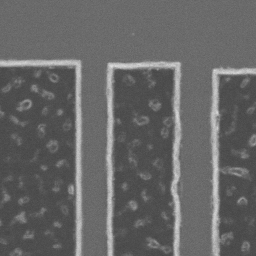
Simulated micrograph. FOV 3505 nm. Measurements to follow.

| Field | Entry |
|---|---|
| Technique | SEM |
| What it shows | one or a few lines or trenches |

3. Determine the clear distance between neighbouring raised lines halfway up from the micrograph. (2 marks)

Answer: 443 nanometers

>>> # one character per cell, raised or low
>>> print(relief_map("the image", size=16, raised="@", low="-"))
----------------
----------------
----------------
----------------
@@@@@--@@@@----@
@@@@@--@@@@--@@@
@@@@@--@@@@--@@@
@@@@@--@@@@--@@@
@@@@@--@@@@--@@@
@@@@@--@@@@--@@@
@@@@@--@@@@--@@@
@@@@@--@@@@--@@@
@@@@@--@@@@--@@@
@@@@@--@@@@--@@@
@@@@@--@@@@--@@@
@@@@@--@@@@--@@@